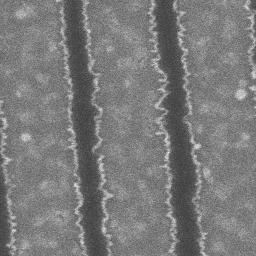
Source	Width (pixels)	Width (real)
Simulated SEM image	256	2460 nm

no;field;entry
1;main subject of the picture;one or a few lines or trenches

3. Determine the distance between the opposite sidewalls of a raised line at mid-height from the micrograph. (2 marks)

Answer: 29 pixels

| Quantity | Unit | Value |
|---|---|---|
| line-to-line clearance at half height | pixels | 65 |